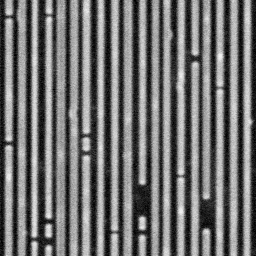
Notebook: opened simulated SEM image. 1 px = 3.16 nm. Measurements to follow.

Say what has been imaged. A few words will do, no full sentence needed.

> parallel lines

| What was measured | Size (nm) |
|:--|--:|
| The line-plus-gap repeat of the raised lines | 41.9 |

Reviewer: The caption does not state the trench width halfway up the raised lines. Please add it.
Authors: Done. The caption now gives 0.0245 micrometres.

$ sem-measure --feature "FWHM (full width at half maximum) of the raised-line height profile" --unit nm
19